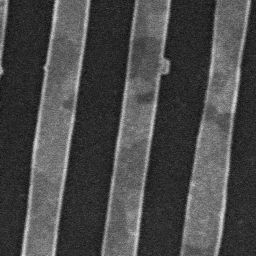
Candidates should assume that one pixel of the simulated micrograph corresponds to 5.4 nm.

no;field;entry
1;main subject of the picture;one or a few lines or trenches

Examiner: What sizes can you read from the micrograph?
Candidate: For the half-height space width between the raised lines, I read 0.26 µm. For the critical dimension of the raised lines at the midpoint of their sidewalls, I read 173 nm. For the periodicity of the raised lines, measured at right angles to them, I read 432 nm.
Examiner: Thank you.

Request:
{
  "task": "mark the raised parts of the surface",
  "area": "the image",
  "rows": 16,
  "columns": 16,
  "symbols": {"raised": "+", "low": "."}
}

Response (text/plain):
...++...+++...++
...++...++...++.
...++...++...++.
...++...++...++.
...++...++...++.
...++...++...++.
...++...++...++.
..+++...++...+..
..++...++...++..
..++...++...++..
..++...++...++..
..++...++...++..
..++...++...++..
..++...++...++..
..+....++..+++..
.++...++...+++..